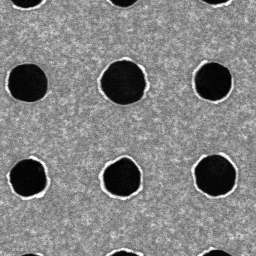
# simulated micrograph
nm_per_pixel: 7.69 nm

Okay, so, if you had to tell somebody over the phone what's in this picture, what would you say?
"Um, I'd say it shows holes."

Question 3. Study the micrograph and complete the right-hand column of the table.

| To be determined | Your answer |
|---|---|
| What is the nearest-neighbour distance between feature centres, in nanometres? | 714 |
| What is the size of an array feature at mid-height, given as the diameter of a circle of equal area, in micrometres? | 0.298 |